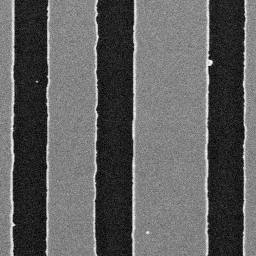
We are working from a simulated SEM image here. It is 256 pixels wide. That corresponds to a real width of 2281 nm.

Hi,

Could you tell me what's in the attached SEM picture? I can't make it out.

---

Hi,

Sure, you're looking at lines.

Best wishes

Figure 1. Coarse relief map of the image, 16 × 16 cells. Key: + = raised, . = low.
+..+++..+++++..+
+..+++..+++++..+
+..+++..+++++..+
+..+++..+++++..+
+..+++..+++++..+
+..+++..+++++..+
+..+++..+++++..+
+..+++..+++++..+
+..+++..+++++..+
+..+++..+++++..+
+..+++..+++++..+
+..+++..+++++..+
+..+++..+++++..+
+..+++..+++++..+
+..+++..+++++..+
+..+++..+++++..+